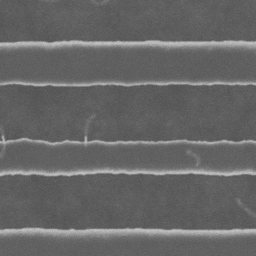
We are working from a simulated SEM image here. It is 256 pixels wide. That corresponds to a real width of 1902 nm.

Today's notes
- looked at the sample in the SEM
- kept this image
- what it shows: lines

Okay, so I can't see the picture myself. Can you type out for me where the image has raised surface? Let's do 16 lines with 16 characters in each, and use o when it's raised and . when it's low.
................
................
................
oooooooooooooooo
oooooooooooooooo
................
................
................
................
oooooooooooooooo
oooooooooooooooo
................
................
................
oooooooooooooooo
oooooooooooooooo